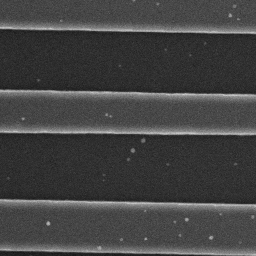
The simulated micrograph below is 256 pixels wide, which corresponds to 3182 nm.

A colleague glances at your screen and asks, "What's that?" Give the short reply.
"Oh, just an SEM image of lines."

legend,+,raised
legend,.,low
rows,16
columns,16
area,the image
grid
++++++++++++++++
++++++++++++++++
................
................
................
................
++++++++++++++++
++++++++++++++++
................
................
................
................
................
++++++++++++++++
++++++++++++++++
++++++++++++++++